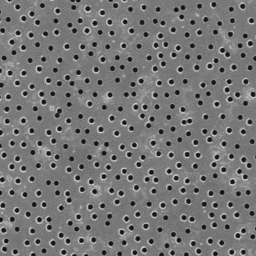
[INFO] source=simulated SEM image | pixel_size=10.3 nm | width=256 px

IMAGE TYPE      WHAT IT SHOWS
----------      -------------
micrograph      a regular array of holes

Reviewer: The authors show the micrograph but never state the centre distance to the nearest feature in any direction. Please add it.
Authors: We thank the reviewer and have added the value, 0.111 microns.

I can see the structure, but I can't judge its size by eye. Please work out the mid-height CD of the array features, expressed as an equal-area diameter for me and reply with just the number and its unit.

49.4 nanometers